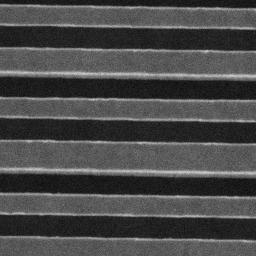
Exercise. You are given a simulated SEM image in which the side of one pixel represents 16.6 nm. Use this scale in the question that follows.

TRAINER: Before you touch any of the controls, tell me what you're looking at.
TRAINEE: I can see lines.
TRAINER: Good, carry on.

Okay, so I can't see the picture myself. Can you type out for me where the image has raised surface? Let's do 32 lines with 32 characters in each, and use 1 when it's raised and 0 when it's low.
00000000000000000000000000000000
11111111111111111111111111111111
11111111111111111111111111111111
00000000000000000000000000000111
00000000000000000000000000000000
00000000000000000000000000000000
11111111111111111111111111111111
11111111111111111111111111111111
11111111111111111111111111111111
00000000000000111111111111111111
00000000000000000000000000000000
00000000000000000000000000000000
11111111111111111111100000000000
11111111111111111111111111111111
11111111111111111111111111111111
00000000000000000000000000000000
00000000000000000000000000000000
00000000000000000000000000000000
11111111111111111111111111111111
11111111111111111111111111111111
11111111111111111111111111111111
00000000001111111111111111111111
00000000000000000000000000000000
00000000000000000000000000000000
11111111111111111111000000000000
11111111111111111111111111111111
11111111111111111111111111111111
00000000000000000000000000000000
00000000000000000000000000000000
00000000000000000000000000000000
11111111111111111111111111111111
11111111111111111111111111111111